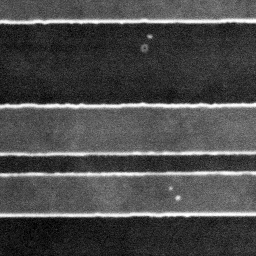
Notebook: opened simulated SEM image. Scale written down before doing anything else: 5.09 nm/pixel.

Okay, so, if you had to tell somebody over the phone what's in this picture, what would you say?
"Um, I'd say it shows lines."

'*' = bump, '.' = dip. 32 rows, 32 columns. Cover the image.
********************************
********************************
********************************
................................
................................
................................
................................
................................
................................
................................
................................
................................
................................
********************************
********************************
********************************
********************************
********************************
********************************
********************************
********************************
********************************
********************************
********************************
********************************
********************************
********************************
................................
................................
................................
................................
................................